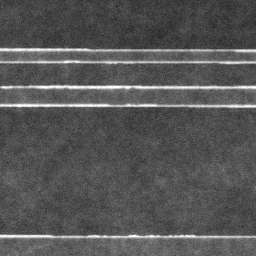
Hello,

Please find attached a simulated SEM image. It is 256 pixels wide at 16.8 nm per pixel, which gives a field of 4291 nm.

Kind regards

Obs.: lines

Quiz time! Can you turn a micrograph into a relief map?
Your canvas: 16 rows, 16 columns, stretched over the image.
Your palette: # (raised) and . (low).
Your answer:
................
................
................
################
################
################
################
................
................
................
................
................
................
................
................
################